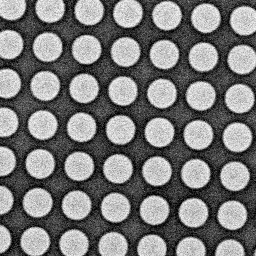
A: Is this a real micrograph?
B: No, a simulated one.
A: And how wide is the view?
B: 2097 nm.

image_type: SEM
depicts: an array of small figures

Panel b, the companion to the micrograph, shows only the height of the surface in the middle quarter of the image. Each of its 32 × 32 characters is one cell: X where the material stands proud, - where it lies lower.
---------------X-------XXXX-----
--------------------------------
--------------------------------
---XXXX------XXX----------------
--XXXXXX----XXXXX-----XXXXX-----
--XXXXXX---XXXXXXX---XXXXXX-----
--XXXXXX---XXXXXXX---XXXXXXX---X
--XXXXXX---XXXXXXX---XXXXXXX---X
--XXXXXX----XXXXXX---XXXXXXX---X
----XX-------XXXX-----XXXXX----X
-----------------------XXX------
--------------------------------
---XX---------------------------
--XXXXX-----XXXX----------------
-XXXXXXX---XXXXXX----XXXXX------
-XXXXXXX---XXXXXXX---XXXXXX----X
-XXXXXXX---XXXXXXX--XXXXXXX---XX
-XXXXXX----XXXXXX---XXXXXXX---XX
--XXXXX----XXXXXX----XXXXXX---XX
------------XXXX-----XXXXX-----X
-----------------------XX------X
--------------------------------
--XXX---------------------------
-XXXXXX----XXXXX------XXX-------
XXXXXXX---XXXXXXX----XXXXX-----X
XXXXXXX---XXXXXXX---XXXXXX----XX
XXXXXXX---XXXXXXX---XXXXXXX---XX
-XXXXXX---XXXXXXX---XXXXXXX--XXX
--XXXX-----XXXXX----XXXXXX----XX
------------XXX------XXXXX----XX
-------------------------------X
--------------------------------